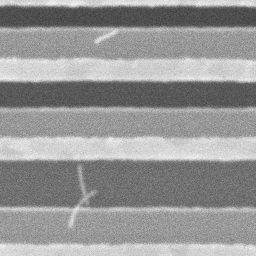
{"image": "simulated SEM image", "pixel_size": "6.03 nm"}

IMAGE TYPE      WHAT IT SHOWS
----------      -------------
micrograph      lines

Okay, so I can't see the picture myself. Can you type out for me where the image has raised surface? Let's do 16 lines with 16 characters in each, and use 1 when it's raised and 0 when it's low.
0000000000000000
0000000000000000
1111111111111111
1111111111111111
1111111111111111
0000000000000000
0000000000000000
1111111111111111
1111111111111111
1111111111111111
0000000000000000
0000000000000000
0000000000000000
1111111111111111
1111111111111111
1111111111111111